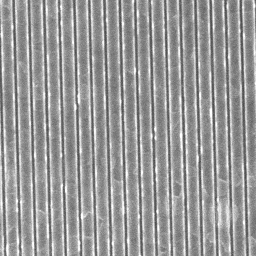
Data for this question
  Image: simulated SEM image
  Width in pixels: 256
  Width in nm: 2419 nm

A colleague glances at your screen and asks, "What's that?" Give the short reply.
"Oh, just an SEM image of parallel lines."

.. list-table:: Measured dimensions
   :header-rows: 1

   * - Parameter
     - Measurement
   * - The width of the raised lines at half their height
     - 112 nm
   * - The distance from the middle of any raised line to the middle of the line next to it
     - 143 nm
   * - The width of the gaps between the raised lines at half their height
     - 0.0319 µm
